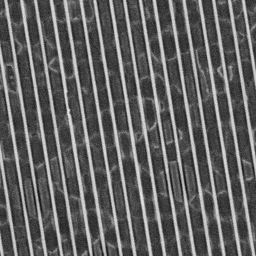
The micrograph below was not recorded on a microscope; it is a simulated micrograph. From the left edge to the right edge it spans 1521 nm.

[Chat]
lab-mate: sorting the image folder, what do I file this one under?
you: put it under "parallel lines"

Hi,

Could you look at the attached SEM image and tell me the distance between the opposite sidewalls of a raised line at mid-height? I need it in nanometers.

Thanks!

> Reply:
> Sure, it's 11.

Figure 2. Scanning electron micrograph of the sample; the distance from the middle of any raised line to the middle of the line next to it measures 87 nm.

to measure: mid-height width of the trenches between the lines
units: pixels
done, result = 12.3